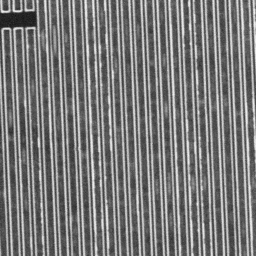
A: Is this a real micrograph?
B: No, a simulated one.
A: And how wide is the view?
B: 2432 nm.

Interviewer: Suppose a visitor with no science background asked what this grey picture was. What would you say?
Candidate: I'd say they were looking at parallel lines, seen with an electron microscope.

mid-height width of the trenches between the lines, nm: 72.4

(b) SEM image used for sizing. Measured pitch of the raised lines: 114 nanometres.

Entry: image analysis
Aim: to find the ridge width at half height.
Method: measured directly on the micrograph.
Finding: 0.0403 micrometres